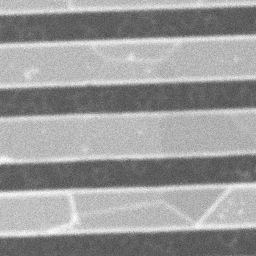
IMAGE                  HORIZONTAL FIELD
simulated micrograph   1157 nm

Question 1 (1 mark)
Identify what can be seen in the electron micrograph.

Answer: one or a few lines or trenches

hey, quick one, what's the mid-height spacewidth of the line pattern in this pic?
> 144 nm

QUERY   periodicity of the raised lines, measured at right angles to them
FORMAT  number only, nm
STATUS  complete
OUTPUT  335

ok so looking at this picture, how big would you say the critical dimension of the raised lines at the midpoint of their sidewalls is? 190 nanometres